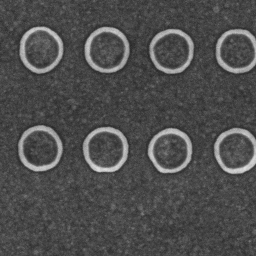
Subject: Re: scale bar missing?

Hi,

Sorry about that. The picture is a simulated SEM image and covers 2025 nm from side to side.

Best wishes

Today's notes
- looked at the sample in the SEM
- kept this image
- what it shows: raised bodies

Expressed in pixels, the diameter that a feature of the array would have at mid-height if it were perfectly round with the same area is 41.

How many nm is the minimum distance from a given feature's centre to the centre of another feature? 511